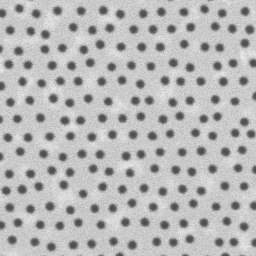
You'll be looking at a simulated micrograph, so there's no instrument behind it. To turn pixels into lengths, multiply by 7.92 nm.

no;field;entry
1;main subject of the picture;a regular array of holes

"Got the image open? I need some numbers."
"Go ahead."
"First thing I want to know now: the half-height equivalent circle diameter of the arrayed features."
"8.89 px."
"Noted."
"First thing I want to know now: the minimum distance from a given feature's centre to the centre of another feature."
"0.137 micrometres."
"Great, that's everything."